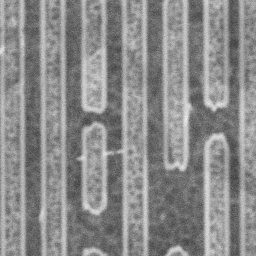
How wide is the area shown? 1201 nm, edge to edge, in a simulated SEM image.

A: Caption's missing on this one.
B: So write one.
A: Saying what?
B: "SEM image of parallel lines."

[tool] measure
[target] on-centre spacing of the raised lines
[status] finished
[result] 192 nm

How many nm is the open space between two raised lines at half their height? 97.3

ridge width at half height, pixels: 19.8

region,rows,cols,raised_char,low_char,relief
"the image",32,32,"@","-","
@@@--@@@--@@@---@@---@@---@@--@@
@@@--@@@--@@@---@@---@@---@@--@@
@@@--@@@--@@@---@@---@@---@@--@@
@@@--@@@--@@@---@@---@@---@@--@@
@@@--@@@--@@@---@@---@@---@@--@@
@@@--@@@--@@@---@@---@@---@@--@@
@@@--@@@---@@---@@---@@---@@--@@
@@@--@@@---@@---@@---@@---@@--@@
@@@--@@@---@@---@@---@@---@@--@@
@@@--@@@---@@---@@---@@---@@--@@
@@@--@@@---@@---@@---@@---@@--@@
@@@--@@@---@@---@@---@@---@@--@@
@@@--@@@---@@---@@---@@---@@--@@
@@@--@@@---@@---@@---@@-------@@
@@@--@@@--------@@---@@-------@@
@@@--@@@--------@@---@@-------@@
@@@--@@@---@@---@@---@@-------@@
@@@--@@@---@@---@@---@@---@@--@@
@@@--@@@---@@---@@---@@---@@--@@
@@@--@@@--@@@---@@---@@---@@--@@
@@@--@@@---@@---@@---@@---@@--@@
@@@---@@---@@---@@--------@@--@@
@@@---@@---@@---@@--------@@--@@
@@@---@@---@@---@@--------@@--@@
@@@---@@---@@---@@--------@@--@@
@@@--@@@---@@---@@--------@@--@@
@@@--@@@--------@@--------@@--@@
@@@---@@--------@@--------@@--@@
@@@--@@@--------@@--------@@--@@
@@@--@@@--------@@--------@@--@@
@@@---@@--------@@--------@@--@@
@@@---@@---@----@@---@@---@@--@@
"